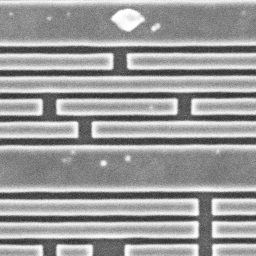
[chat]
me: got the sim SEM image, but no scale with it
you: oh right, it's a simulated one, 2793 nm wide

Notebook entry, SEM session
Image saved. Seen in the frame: groups of lines, slits or small figures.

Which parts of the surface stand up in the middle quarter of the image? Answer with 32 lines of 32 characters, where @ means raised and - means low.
@@@@@@@@@@@@----@@@@@@@@@@@@@@@@
--------------------------------
--------------------------------
@@@@@@@@@@@@@@@@@@@@@@@@@@@@@@@@
@@@@@@@@@@@@@@@@@@@@@@@@@@@@@@@@
@@@@@@@@@@@@@@@@@@@@@@@@@@@@@@@@
@@@@@@@@@@@@@@@@@@@@@@@@@@@@@@@@
--------------------------------
--------------------------------
@@@@@@@@@@@@@@@@@@@@@@@@@@@@----
@@@@@@@@@@@@@@@@@@@@@@@@@@@@----
@@@@@@@@@@@@@@@@@@@@@@@@@@@@----
--------------------------------
--------------------------------
--------------------------------
@@@----@@@@@@@@@@@@@@@@@@@@@@@@@
@@@----@@@@@@@@@@@@@@@@@@@@@@@@@
@@@----@@@@@@@@@@@@@@@@@@@@@@@@@
--------------------------------
--------------------------------
--------------------------------
@@@@@@@@@@@@@@@@@@@@@@@@@@@@@@@@
@@@@@@@@@@@@@@@@@@@@@@@@@@@@@@@@
@@@@@@@@@@@@@@@@@@@@@@@@@@@@@@@@
@@@@@@@@@@@@@@@@@@@@@@@@@@@@@@@@
@@@@@@@@@@@@@@@@@@@@@@@@@@@@@@@@
@@@@@@@@@@@@@@@@@@@@@@@@@@@@@@@@
@@@@@@@@@@@@@@@@@@@@@@@@@@@@@@@@
@@@@@@@@@@@@@@@@@@@@@@@@@@@@@@@@
@@@@@@@@@@@@@@@@@@@@@@@@@@@@@@@@
@@@@@@@@@@@@@@@@@@@@@@@@@@@@@@@@
@@@@@@@@@@@@@@@@@@@@@@@@@@@@@@@@